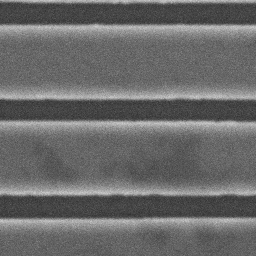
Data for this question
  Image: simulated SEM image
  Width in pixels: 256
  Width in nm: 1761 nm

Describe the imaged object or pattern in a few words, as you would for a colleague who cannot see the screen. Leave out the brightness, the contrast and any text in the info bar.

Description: lines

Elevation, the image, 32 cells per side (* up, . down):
................................
................................
................................
********************************
********************************
********************************
********************************
********************************
********************************
********************************
********************************
********************************
................................
................................
................................
********************************
********************************
********************************
********************************
********************************
********************************
********************************
********************************
********************************
................................
................................
................................
********************************
********************************
********************************
********************************
********************************